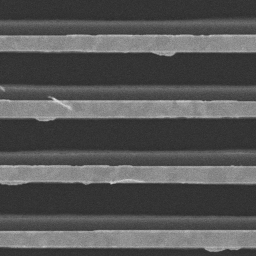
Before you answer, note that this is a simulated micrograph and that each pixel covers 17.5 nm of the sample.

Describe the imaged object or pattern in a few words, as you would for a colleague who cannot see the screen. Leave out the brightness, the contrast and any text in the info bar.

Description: lines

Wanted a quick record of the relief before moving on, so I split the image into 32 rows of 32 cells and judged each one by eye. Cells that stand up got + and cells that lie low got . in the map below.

................................
................................
................................
++++++++++++++++++++++++++++++++
++++++++++++++++++++++++++++++++
++++++++++++++++++++++++++++++++
...............+...+++......++.+
................................
................................
................................
................................
++++++++++++++++++++++++++++++++
++++++++++++++++++++++++++++++++
++++++++++++++++++++++++++++++++
++++++++++++++++++++++++++++++++
................................
................................
................................
................................
++++++++++++++++++++++++++++++++
++++++++++++++++++++++++++++++++
++++++++++++++++++++++++++++++++
++++++++++++++++++++++++++++++++
................................
................................
................................
................................
++++++++++++++++++++++++++++++++
++++++++++++++++++++++++++++++++
++++++++++++++++++++++++++++++++
++++++++++++++++++++++++++++++++
................................